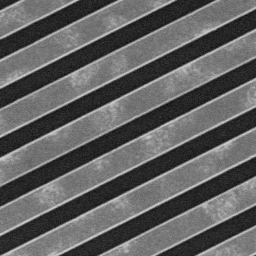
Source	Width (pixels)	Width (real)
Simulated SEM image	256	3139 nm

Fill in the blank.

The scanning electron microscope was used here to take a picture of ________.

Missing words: parallel lines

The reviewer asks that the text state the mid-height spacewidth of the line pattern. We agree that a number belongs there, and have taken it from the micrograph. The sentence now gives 242 nm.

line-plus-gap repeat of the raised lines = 537 nanometres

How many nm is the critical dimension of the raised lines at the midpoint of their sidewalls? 302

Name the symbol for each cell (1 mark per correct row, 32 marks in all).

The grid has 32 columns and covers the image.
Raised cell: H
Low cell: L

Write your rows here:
LLHHHHHHHLLLLLHHHHHHHLLLLLHHHHHH
HHHHHHHLLLLLHHHHHHHLLLLLHHHHHHHL
HHHHHLLLLLHHHHHHHLLLLLHHHHHHHLLL
HHHLLLLLHHHHHHHLLLLLHHHHHHHLLLLL
HLLLLLHHHHHHHLLLLLHHHHHHHLLLLLLH
LLLLHHHHHHHLLLLLHHHHHHHLLLLLLHHH
LLHHHHHHHLLLLLHHHHHHHLLLLLLHHHHH
HHHHHHHLLLLLHHHHHHHLLLLLLHHHHHHL
HHHHHLLLLLHHHHHHHLLLLLLHHHHHHLLL
HHHLLLLLHHHHHHHLLLLLLHHHHHHLLLLL
HLLLLLHHHHHHHLLLLLLHHHHHHLLLLLLH
LLLLLHHHHHHLLLLLLHHHHHHLLLLLLHHH
LLHHHHHHHLLLLLLHHHHHHLLLLLLHHHHH
LHHHHHHLLLLLLHHHHHHLLLLLLHHHHHHH
HHHHHLLLLLLHHHHHHLLLLLLHHHHHHHLL
HHHLLLLLLHHHHHHLLLLLLHHHHHHHLLLL
HLLLLLLHHHHHHLLLLLLHHHHHHHLLLLLH
LLLLLHHHHHHLLLLLLHHHHHHHLLLLLHHH
LLLHHHHHHLLLLLLHHHHHHHLLLLLHHHHH
LHHHHHHLLLLLLHHHHHHHLLLLLHHHHHHH
HHHHHLLLLLLHHHHHHHLLLLLHHHHHHHLL
HHHLLLLLLHHHHHHHLLLLLHHHHHHHLLLL
HHLLLLLHHHHHHHLLLLLHHHHHHHLLLLLH
LLLLLHHHHHHHLLLLLHHHHHHHLLLLLHHH
LLLHHHHHHHLLLLLHHHHHHHLLLLLHHHHH
LHHHHHHHLLLLLHHHHHHHLLLLLHHHHHHH
HHHHHHLLLLLHHHHHHHLLLLLHHHHHHHLL
HHHHLLLLLHHHHHHHLLLLLHHHHHHHLLLL
HHLLLLLHHHHHHHLLLLLHHHHHHHLLLLLL
LLLLLHHHHHHHLLLLLHHHHHHHLLLLLLHH
LLLHHHHHHHLLLLLLHHHHHHLLLLLLHHHH
LHHHHHHHLLLLLLHHHHHHLLLLLLHHHHHH